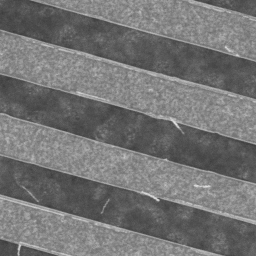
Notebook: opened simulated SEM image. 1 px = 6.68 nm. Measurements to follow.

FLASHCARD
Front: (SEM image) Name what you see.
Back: one or a few lines or trenches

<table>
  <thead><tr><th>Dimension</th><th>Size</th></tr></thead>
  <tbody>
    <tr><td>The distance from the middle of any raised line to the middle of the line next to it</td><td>0.532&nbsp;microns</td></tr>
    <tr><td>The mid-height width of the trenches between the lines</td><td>257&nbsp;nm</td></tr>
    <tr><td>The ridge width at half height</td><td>275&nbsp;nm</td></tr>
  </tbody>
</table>